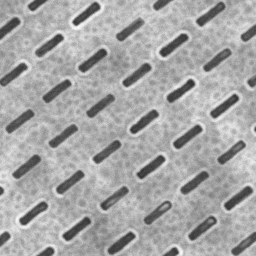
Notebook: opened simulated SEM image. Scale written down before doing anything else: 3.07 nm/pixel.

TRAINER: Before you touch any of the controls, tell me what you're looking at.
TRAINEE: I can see a regular array of holes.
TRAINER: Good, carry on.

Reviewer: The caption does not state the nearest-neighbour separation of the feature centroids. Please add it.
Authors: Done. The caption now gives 141 nm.